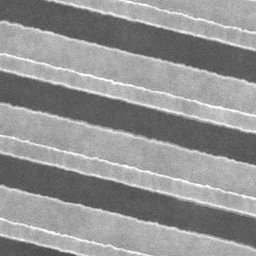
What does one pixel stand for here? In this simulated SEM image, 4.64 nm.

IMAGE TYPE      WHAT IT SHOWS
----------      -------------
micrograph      lines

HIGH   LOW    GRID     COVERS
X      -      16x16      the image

-----XXXXXXXXXXX
X--------XXXXXXX
XXXXX--------XXX
XXXXXXXXX-------
-XXXXXXXXXXXX---
-----XXXXXXXXXXX
---------XXXXXXX
XXXX---------XXX
XXXXXXXXX-------
XXXXXXXXXXXX----
----XXXXXXXXXXXX
--------XXXXXXXX
XXXX--------XXXX
XXXXXXXX--------
XXXXXXXXXXXX----
---XXXXXXXXXXXXX